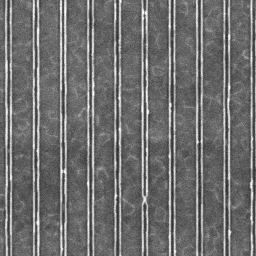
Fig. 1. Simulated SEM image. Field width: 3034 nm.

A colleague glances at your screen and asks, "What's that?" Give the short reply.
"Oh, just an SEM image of parallel lines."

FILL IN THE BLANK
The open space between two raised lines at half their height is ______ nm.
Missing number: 259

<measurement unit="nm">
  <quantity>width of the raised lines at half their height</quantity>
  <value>62.2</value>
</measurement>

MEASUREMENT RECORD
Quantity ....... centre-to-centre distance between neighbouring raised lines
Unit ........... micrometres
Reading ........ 0.322